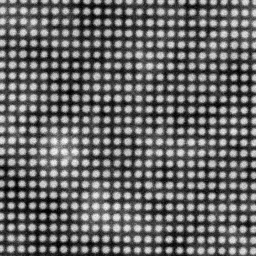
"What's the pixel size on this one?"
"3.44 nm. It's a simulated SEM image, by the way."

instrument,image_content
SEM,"a regular array of raised bodies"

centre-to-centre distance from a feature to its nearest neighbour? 35.2 nm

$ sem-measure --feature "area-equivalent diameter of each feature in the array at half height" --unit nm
22.6